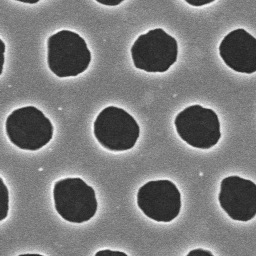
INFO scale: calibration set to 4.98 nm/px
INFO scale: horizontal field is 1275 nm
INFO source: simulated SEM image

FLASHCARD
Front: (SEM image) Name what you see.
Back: holes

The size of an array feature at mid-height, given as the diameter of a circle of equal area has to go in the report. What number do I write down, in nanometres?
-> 221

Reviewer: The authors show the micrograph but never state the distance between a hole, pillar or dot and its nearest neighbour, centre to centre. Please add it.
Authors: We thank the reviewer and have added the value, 0.416 microns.